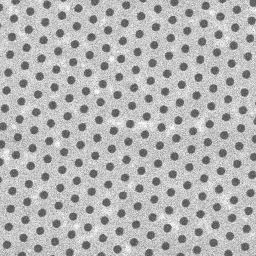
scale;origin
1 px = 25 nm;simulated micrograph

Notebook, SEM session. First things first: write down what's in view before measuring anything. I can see a regular array of holes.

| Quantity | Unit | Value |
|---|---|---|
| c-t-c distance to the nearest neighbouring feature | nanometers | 446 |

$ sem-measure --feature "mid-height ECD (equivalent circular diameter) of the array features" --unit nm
217